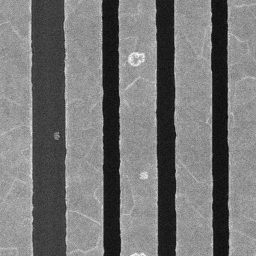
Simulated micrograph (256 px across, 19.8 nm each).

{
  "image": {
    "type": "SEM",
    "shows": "lines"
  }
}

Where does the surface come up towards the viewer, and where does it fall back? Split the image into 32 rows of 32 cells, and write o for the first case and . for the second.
oooo....ooooo..oooo...oooo..oooo
oooo....ooooo..ooooo..oooo...ooo
oooo....ooooo..oooo...oooo...ooo
oooo....ooooo..ooooo..oooo...ooo
oooo....ooooo..ooooo..oooo...ooo
oooo....ooooo..ooooo..oooo...ooo
oooo....ooooo..ooooo..oooo...ooo
oooo....ooooo..ooooo..oooo...ooo
oooo....ooooo..ooooo..oooo...ooo
oooo....ooooo..ooooo..oooo...ooo
oooo....ooooo..ooooo..oooo...ooo
oooo....ooooo..ooooo..oooo...ooo
oooo....ooooo..ooooo..oooo...ooo
oooo....ooooo..ooooo..oooo...ooo
oooo....ooooo..ooooo..oooo...ooo
oooo....ooooo..ooooo..oooo...ooo
oooo....ooooo..ooooo..oooo...ooo
oooo....ooooo..ooooo..oooo...ooo
oooo....ooooo..ooooo..oooo...ooo
oooo....ooooo..ooooo..oooo...ooo
oooo....ooooo..ooooo..oooo...ooo
oooo....ooooo..ooooo..oooo...ooo
oooo....ooooo..ooooo..ooooo..ooo
oooo....ooooo..ooooo..ooooo..ooo
oooo....ooooo..ooooo..ooooo..ooo
oooo....ooooo..ooooo..ooooo..ooo
oooo....ooooo..ooooo..ooooo..ooo
oooo....ooooo..ooooo..ooooo..ooo
oooo....ooooo..ooooo..ooooo..ooo
oooo....ooooo..ooooo..ooooo..ooo
oooo....ooooo..ooooo..ooooo..ooo
oooo....ooooo..ooooo..ooooo..ooo